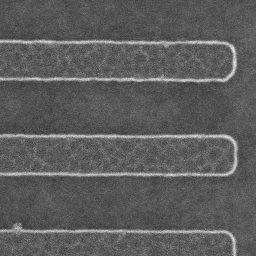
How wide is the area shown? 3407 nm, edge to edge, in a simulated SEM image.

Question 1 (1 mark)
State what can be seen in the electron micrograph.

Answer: one or a few lines or trenches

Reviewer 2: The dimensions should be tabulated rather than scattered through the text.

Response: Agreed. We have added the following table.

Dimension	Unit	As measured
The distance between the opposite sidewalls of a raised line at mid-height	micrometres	0.516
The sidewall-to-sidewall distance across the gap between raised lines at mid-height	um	0.744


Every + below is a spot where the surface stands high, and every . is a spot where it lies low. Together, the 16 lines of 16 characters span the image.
................
................
................
+++++++++++++++.
+++++++++++++++.
................
................
................
++.....+..+++...
+++++++++++++++.
+++++++++++++++.
................
................
................
++++++++++++++..
+++++++++++++++.